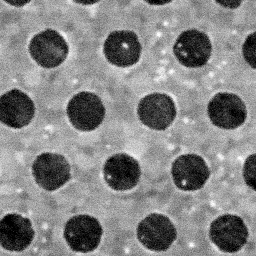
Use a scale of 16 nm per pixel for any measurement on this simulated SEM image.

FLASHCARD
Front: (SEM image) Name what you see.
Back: a regular array of holes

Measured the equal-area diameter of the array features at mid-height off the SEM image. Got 643 nm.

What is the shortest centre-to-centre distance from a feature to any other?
1110 nm